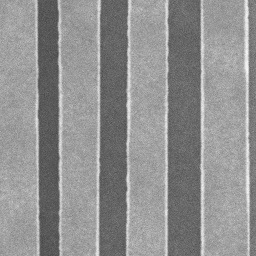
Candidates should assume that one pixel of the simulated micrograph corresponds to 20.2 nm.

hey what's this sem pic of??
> lines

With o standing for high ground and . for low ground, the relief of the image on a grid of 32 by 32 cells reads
ooooo..oooooo...ooooo....oooooo.
ooooo..ooooo....ooooo....oooooo.
ooooo..ooooo....ooooo....oooooo.
ooooo..ooooo....ooooo....oooooo.
ooooo..ooooo....ooooo....oooooo.
ooooo..ooooo....ooooo....oooooo.
ooooo..ooooo....ooooo....oooooo.
ooooo..ooooo....ooooo....oooooo.
ooooo..ooooo....ooooo....oooooo.
ooooo..ooooo....ooooo....oooooo.
ooooo..ooooo....ooooo....oooooo.
ooooo..ooooo....ooooo....oooooo.
ooooo..ooooo....ooooo....oooooo.
ooooo..ooooo....ooooo....oooooo.
ooooo..ooooo....ooooo....oooooo.
ooooo..ooooo....ooooo....oooooo.
ooooo..ooooo....ooooo....oooooo.
ooooo..ooooo....ooooo....oooooo.
ooooo..ooooo....ooooo....oooooo.
ooooo..ooooo....ooooo....oooooo.
ooooo..ooooo....ooooo....oooooo.
ooooo..ooooo....ooooo....oooooo.
ooooo..ooooo....ooooo....oooooo.
ooooo..ooooo....ooooo....oooooo.
ooooo...oooo....ooooo....oooooo.
ooooo...oooo....ooooo....oooooo.
ooooo..ooooo....ooooo....oooooo.
ooooo...oooo....ooooo....oooooo.
ooooo..ooooo....ooooo....oooooo.
ooooo...oooo....ooooo....oooooo.
ooooo..ooooo....ooooo....oooooo.
ooooo...oooo....ooooo....oooooo.